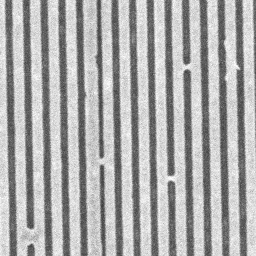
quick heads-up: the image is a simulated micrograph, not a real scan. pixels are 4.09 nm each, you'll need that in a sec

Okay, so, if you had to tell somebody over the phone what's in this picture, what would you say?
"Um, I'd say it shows parallel lines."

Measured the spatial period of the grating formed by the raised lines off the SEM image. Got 17.7 pixels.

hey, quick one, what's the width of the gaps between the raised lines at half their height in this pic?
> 32.7 nanometers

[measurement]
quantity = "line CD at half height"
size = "39.9 nanometres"